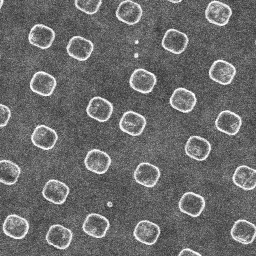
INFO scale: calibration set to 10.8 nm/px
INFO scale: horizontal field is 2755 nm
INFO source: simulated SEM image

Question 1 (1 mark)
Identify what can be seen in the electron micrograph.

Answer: a regular array of raised bodies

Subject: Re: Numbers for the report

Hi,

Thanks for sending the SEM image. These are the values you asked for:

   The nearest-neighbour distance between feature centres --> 482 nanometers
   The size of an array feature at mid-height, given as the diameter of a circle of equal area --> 253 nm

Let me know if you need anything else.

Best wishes